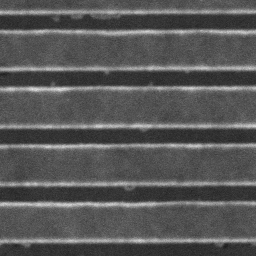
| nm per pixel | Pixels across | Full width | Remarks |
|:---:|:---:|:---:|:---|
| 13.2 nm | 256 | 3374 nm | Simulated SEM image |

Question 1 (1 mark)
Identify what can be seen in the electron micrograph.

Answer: lines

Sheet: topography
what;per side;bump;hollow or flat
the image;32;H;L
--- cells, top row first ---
HHHHHHHHHHHHHHHHHHHHHHHHHHHHHHHH
HHHHHHHHHHHHHHHHHHHHHHHHHHHHHHHH
LLLLLLLLLLLLLLLLLLLLLLLLLLLLLLLL
LLLLLLLLLLLLLLLLLLLLLLLLLLLLLLLL
HHHHHHHHHHHHHHHHHHHHHHHHHHHHHHHH
HHHHHHHHHHHHHHHHHHHHHHHHHHHHHHHH
HHHHHHHHHHHHHHHHHHHHHHHHHHHHHHHH
HHHHHHHHHHHHHHHHHHHHHHHHHHHHHHHH
HHHHHHHHHHHHHHHHHHHHHHHHHHHHHHHH
LLLLLLLLLLLLLLLLLLLLLLLLLLLLLLLL
LLLLLLLLLLLLLLLLLLLLLLLLLLLLLLLL
HHHHHHHHHHHHHHHHHHHHHHHHHHHHHHHH
HHHHHHHHHHHHHHHHHHHHHHHHHHHHHHHH
HHHHHHHHHHHHHHHHHHHHHHHHHHHHHHHH
HHHHHHHHHHHHHHHHHHHHHHHHHHHHHHHH
HHHHHHHHHHHHHHHHHHHHHHHHHHHHHHHH
LLLLLLLLLLLLLLLLLLLLLLLLLLLLLLLL
LLLLLLLLLLLLLLLLLLLLLLLLLLLLLLLL
HHHHHHHHHHHHHHHHHHHHHHHHHHHHHHHH
HHHHHHHHHHHHHHHHHHHHHHHHHHHHHHHH
HHHHHHHHHHHHHHHHHHHHHHHHHHHHHHHH
HHHHHHHHHHHHHHHHHHHHHHHHHHHHHHHH
HHHHHHHHHHHHHHHHHHHHHHHHHHHHHHHH
LLLLLLLLLLLLLLLLLLLLLLLLLLLLLLLL
LLLLLLLLLLLLLLLLLLLLLLLLLLLLLLLL
HHHHHHHHHHHHHHHHHHHHHHHHHHHHHHHH
HHHHHHHHHHHHHHHHHHHHHHHHHHHHHHHH
HHHHHHHHHHHHHHHHHHHHHHHHHHHHHHHH
HHHHHHHHHHHHHHHHHHHHHHHHHHHHHHHH
HHHHHHHHHHHHHHHHHHHHHHHHHHHHHHHH
LLLLLLLLLLLLLLLLLLLLLLLLLLLLLLLL
LLLLLLLLLLLLLLLLLLLLLLLLLLLLLLLL